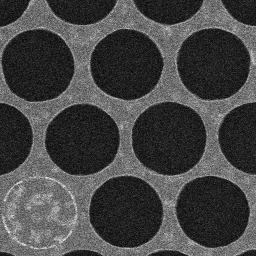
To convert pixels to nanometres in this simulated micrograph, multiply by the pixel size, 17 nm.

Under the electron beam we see holes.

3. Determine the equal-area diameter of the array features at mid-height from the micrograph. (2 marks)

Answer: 1.25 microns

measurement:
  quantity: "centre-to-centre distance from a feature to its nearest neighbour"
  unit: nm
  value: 1440